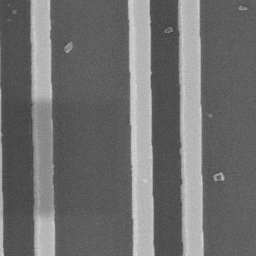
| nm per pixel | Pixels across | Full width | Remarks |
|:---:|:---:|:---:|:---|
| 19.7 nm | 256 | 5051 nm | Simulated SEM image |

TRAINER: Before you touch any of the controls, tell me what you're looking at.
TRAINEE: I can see lines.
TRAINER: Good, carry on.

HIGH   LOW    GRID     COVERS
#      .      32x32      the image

....##..........###...###.......
....##..........###...###.......
....##..........###....##.......
....##..........###....##.......
....##..........###....##.......
....##..........###....##.......
....##..........###....##.......
....##..........###....##.......
....##..........###....##.......
....##...........##....##.......
....##...........##....##.......
....##...........##....##.......
....##...........##....##.......
....##...........##....##.......
....##...........##....##.......
....###..........##....##.......
....###..........##....##.......
....###..........##....##.......
....###..........##....##.......
....###..........##....##.......
....###..........##....##.......
....###..........##....##.......
....###..........##....##.......
....###..........##....##.......
.....##..........##....##.......
.....##..........##....##.......
.....##..........##....##.......
.....##..........##....##.......
.....##..........##....##.......
.....##..........##....##.......
.....##..........##....##.......
.....##..........##....##.......